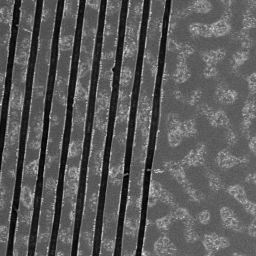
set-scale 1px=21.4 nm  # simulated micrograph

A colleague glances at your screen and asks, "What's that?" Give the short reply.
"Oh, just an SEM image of parallel lines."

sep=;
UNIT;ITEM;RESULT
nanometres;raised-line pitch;458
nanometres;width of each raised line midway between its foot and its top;314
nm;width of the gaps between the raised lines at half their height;138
